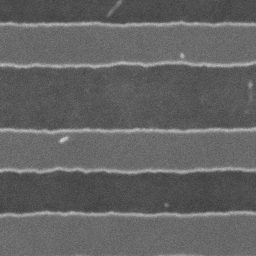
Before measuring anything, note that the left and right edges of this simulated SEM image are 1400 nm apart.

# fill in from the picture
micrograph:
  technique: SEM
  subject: lines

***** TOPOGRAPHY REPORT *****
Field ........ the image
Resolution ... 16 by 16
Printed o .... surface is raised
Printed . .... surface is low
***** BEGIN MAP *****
................
ooooooo.oooooooo
oooooooooooooooo
oooooooooooooooo
................
................
................
................
oooooooooooooooo
oooooooooooooooo
oooooooooooooooo
................
................
oooooooooooooooo
oooooooooooooooo
oooooooooooooooo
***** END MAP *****